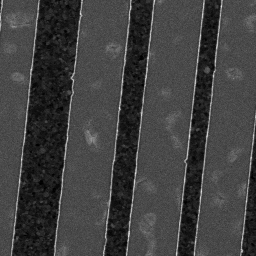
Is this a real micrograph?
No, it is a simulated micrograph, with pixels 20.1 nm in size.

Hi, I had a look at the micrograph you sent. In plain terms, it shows one or a few lines or trenches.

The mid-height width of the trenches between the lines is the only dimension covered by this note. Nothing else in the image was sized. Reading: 976 nanometers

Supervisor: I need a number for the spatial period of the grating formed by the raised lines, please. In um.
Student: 1.52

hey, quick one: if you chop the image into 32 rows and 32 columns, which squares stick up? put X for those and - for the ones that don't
-----XXXXX------XXX------XXX----
-----XXXXX------XXX------XXX----
-----XXXXX------XXX------XX-----
----XXXXXX------XXX------XX-----
----XXXXXX------XXX------XX-----
----XXXXXX------XXX------XX-----
----XXXXXX------XXX------XX-----
----XXXXX-------XX-------XX-----
----XXXXX------XXX-------XX-----
----XXXXX------XXX-------XX-----
----XXXXX------XXX------XXX-----
----XXXXX------XXX------XXX-----
----XXXXX------XXX------XX------
---XXXXXX------XXX------XX------
---XXXXXX------XXX------XX------
---XXXXXX------XXX------XX------
---XXXXX-------XXX------XX------
---XXXXX-------XX-------XX------
---XXXXX------XXX-------XX------
---XXXXX------XXX------XXX-----X
---XXXXX------XXX------XXX-----X
---XXXXX------XXX------XX------X
--XXXXXX------XXX------XX------X
--XXXXXX------XXX------XX------X
--XXXXXX------XXX------XX------X
--XXXXX-------XXX------XX------X
--XXXXX-------XX-------XX------X
--XXXXX------XXX-------XX------X
--XXXXX------XXX------XXX-----XX
--XXXXX------XXX------XXX-----XX
--XXXXX------XXX------XX------XX
-XXXXXX------XXX------XX------XX